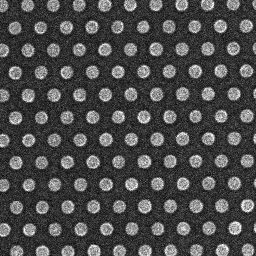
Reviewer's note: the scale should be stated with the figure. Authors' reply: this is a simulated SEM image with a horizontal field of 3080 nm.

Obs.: a regular array of raised bodies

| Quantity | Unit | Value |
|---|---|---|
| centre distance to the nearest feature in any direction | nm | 306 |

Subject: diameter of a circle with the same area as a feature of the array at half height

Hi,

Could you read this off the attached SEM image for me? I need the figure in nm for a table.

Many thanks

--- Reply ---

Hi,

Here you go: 152